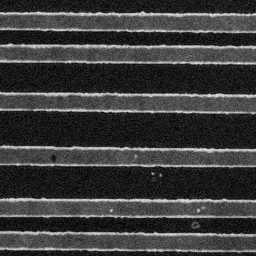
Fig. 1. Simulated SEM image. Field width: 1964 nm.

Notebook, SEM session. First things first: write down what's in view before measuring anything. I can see lines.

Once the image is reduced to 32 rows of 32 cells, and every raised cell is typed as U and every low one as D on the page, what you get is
DDDDDDDDDDDDDDDDDDDDDDDDDDDDDDDD
DDDDDDDDDDDDDDDDDDDDDDDDDDDDDDDD
UUUUUUUUUUUUUUUUUUUUUUUUUUUUUUUU
UUUUUUUUUUUUUUUUUUUUUUUUUUUUUUUU
DDDDDDDDDDDDDDDDDDDDDDDDDDDDDDDD
DDDDDDDDDDDDDDDDDDDDDDDDDDDDDDDD
UUUUUUUUUUUUUUUUUUUUUUUUUUUUUUUU
UUUUUUUUUUUUUUUUUUUUUUUUUUUUUUUU
DDDDDDDDDDDDDDDDDDDDDDDDDDDDDDDD
DDDDDDDDDDDDDDDDDDDDDDDDDDDDDDDD
DDDDDDDDDDDDDDDDDDDDDDDDDDDDDDDD
DDDDDDDDDDDDDDDDDDDDDDDDDDDDDDDD
UUUUUUUUUUUUUUUUUUUUUUUUUUUUUUUU
UUUUUUUUUUUUUUUUUUUUUUUUUUUUUUUU
DDDDDDDDDDDDDDDDDDDDDDDDDDDDDDDD
DDDDDDDDDDDDDDDDDDDDDDDDDDDDDDDD
DDDDDDDDDDDDDDDDDDDDDDDDDDDDDDDD
DDDDDDDDDDDDDDDDDDDDDDDDDDDDDDDD
UUUUUUUUUUUUUUUDDDDDDDDDDDDDDDDD
UUUUUUUUUUUUUUUUUUUUUUUUUUUUUUUU
UUUUUUUUUUUUUUUUUUUUUUUUUUUUUUUU
DDDDDDDDDDDDDDDDDDDDDDDDDDDDDDDD
DDDDDDDDDDDDDDDDDDDDDDDDDDDDDDDD
DDDDDDDDDDDDDDDDDDDDDDDDDDDDDDDD
DDDDDDDDDDDDDDDDDDDDDDDDDDDDDDDD
UUUUUUUUUUUUUUUUUUUUUUUUUUUUUUUU
UUUUUUUUUUUUUUUUUUUUUUUUUUUUUUUU
DDDDDDDDDDDDDDDDDDDDDDDDDDDDDDDD
DDDDDDDDDDDDDDDDDDDDDDDDDDDDDDDD
UUUUUUUUUUUUUUUUUUUUUUUUUUUUUUUU
UUUUUUUUUUUUUUUUUUUUUUUUUUUUUUUU
DDDDDDDDDDDDDDDDDDDDDDDDDDDDDDDD